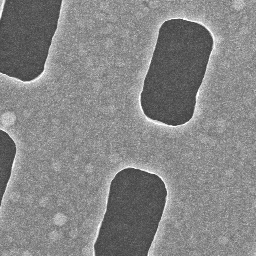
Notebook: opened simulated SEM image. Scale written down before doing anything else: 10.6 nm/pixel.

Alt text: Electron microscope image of holes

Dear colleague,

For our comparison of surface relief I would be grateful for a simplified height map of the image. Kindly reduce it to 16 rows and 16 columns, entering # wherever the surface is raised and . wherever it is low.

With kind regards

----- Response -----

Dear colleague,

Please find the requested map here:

....############
....######..####
...#######...###
...#######...###
...######....###
#########...####
#########...####
##########..####
.###############
.###############
.###############
#######...######
#######...######
######....######
######....######
######...#######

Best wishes